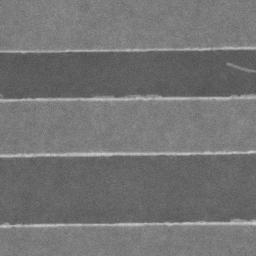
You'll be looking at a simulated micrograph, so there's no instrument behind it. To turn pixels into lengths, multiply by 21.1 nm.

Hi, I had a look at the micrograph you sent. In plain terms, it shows lines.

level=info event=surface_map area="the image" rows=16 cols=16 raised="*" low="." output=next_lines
****************
****************
****************
................
................
................
****************
****************
****************
****************
................
................
................
................
****************
****************